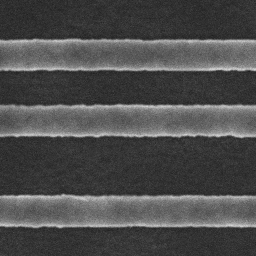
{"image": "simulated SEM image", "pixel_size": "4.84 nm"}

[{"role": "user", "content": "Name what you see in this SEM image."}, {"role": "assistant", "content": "lines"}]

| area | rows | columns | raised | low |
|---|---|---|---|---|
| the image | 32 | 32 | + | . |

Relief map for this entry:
................................
................................
................................
................................
................................
++++++++++++++++++++++++++++++++
++++++++++++++++++++++++++++++++
++++++++++++++++++++++++++++++++
++++++++++++++++++++++++++++++++
................................
................................
................................
................................
++++++++++++++++++++++++++++++++
++++++++++++++++++++++++++++++++
++++++++++++++++++++++++++++++++
++++++++++++++++++++++++++++++++
................................
................................
................................
................................
................................
................................
................................
.+++++.++..............+........
++++++++++++++++++++++++++++++++
++++++++++++++++++++++++++++++++
++++++++++++++++++++++++++++++++
................................
................................
................................
................................